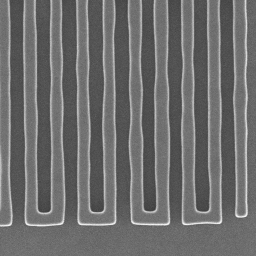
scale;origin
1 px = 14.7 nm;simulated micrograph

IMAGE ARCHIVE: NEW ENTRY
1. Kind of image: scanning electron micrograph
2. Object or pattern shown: groups of lines, slits or small figures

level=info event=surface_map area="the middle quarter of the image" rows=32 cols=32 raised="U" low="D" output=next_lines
DDDUUUDDDDUUDDDDDUUDDDDUUUDDDDUU
DDDUUUDDDDUUDDDDDUUDDDDUUUDDDDUU
DDDUUUDDDDUUUDDDDUUDDDDUUUDDDDUU
DDDUUUDDDDUUUDDDDUUDDDDUUUDDDDUU
DDDUUUDDDDUUUDDDUUUDDDDUUUDDDDUU
DDDUUUDDDDUUUDDDUUUUDDDUUUDDDDUU
DDDUUUDDDDUUUDDDUUUUDDDUUUDDDDUU
DDDUUUDDDDUUUDDDDUUUDDDUUUDDDDUU
DDDUUUDDDDUUUDDDDUUUDDDUUUDDDDUU
DDDUUUDDDDUUUDDDDUUDDDDUUUDDDDUU
DDDUUUDDDDUUUDDDDUUDDDDUUUDDDDUU
DDDUUUDDDDUUUDDDDUUDDDDUUUDDDDUU
DDDUUUDDDDUUUDDDDUUDDDDUUUDDDDUU
DDDUUUDDDDUUUDDDDUUDDDDUUUDDDDUU
DDDUUUDDDDUUUDDDDUUDDDDUUUDDDDUU
DDDUUUDDDDUUUDDDDUUDDDDUUUDDDDUU
DDDDUUDDDDUUUDDDDUUDDDDUUUDDDDUU
DDDDUUDDDDUUUDDDUUUUDDDUUUDDDDUU
DDDDUUDDDDUUUDDDUUUUDDDUUUDDDDUU
DDDDUUDDDDUUUDDDUUUUDDDUUUDDDDUU
DDDDUUDDDDUUUDDDUUUUDDDUUUDDDDUU
DDDDUUDDDDUUUDDDUUUUDDDUUUDDDDUU
DDDDUUDDDDUUUDDDDUUUDDDUUUDDDDUU
DDDDUUDDDDUUUDDDDUUUDDDUUUDDDDUU
DDDDUUDDDDUUUDDDDUUUDDDUUUDDDDUU
DDDDUUDDDDUUUDDDDUUUDDDUUUDDDDUU
DDDUUUDDDDUUUDDDDUUUDDDUUUDDDDUU
DDDUUUDDDDUUUDDDDUUUDDDUUUDDDDUU
DDDUUUDDDDUUUDDDDUUUDDDUUUDDDDUU
DDDUUUDDDDUUUDDDDUUUDDDUUUDDDDUU
DDDDUUDDDDUUUDDDDUUUDDDUUUDDDDUU
DDDDUUDDDDUUUDDDDUUUDDDUUUDDDDUU